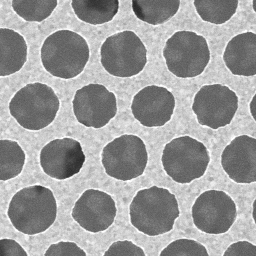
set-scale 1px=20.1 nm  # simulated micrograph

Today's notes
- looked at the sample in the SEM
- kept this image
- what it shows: a regular array of holes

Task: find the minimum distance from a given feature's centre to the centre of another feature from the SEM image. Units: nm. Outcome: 1190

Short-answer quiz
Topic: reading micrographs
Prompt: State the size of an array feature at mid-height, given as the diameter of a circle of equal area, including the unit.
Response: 945 nanometres